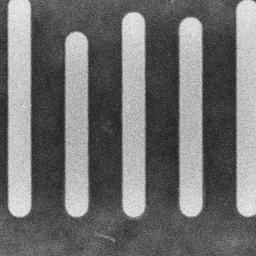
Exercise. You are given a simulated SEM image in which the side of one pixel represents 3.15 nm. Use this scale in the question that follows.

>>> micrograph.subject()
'groups of lines, slits or small figures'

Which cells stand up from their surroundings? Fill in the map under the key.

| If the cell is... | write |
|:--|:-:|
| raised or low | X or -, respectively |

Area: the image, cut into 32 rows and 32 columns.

-XXX--------------------------XX
-XXX--------------------------XX
-XXX-----------XXX-----XX-----XX
-XXX-----------XXX----XXX-----XX
-XXX-----XX----XXX----XXX-----XX
-XXX----XXX----XXX----XXX-----XX
-XXX----XXX----XXX----XXX-----XX
-XXX----XXX----XXX----XXX-----XX
-XXX----XXX----XXX----XXX-----XX
-XXX----XXX----XXX----XXX-----XX
-XXX----XXX----XXX----XXX-----XX
-XXX----XXX----XXX----XXX-----XX
-XXX----XXX----XXX----XXX-----XX
-XXX----XXX----XXX----XXX-----XX
-XXX----XXX----XXX----XXX-----XX
-XXX----XXX----XXX----XXX-----XX
-XXX----XXX----XXX----XXX-----XX
-XXX----XXX----XXX----XXX-----XX
-XXX----XXX----XXX----XXX-----XX
-XXX----XXX----XXX----XXX-----XX
-XXX----XXX----XXX----XXX-----XX
-XXX----XXX----XXX----XXX-----XX
-XXX----XXX----XXX----XXX-----XX
-XXX----XXX----XXX----XXX-----XX
-XXX----XXX----XXX----XXX-----XX
-XXX----XXX----XXX----XXX-----XX
-XXX----XXX-----XX-----XX-----XX
--------------------------------
--------------------------------
--------------------------------
--------------------------------
--------------------------------